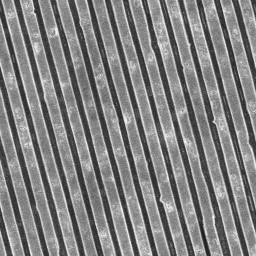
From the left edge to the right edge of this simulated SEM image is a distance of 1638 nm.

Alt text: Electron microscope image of parallel lines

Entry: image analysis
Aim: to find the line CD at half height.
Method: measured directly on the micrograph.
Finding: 71.3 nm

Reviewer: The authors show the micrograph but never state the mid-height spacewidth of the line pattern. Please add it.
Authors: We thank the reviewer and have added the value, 0.041 um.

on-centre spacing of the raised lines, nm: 113